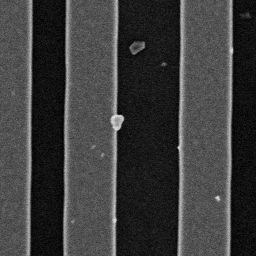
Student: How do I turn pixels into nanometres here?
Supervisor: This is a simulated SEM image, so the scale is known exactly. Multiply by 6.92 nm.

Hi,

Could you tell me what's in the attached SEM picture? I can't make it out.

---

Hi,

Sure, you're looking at groups of lines, slits or small figures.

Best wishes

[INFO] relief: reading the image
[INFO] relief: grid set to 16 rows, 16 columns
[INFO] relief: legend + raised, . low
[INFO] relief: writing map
++..+++....+++..
++..+++....+++..
++..+++....+++..
++..+++....++++.
++..+++....+++..
++..+++....+++..
++..+++....+++..
++..++++...+++..
++..+++....+++..
++..+++....+++..
++..+++....+++..
++..+++....+++..
++..+++....+++..
++..+++....+++..
++..+++....+++..
++..+++....+++..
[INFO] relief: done